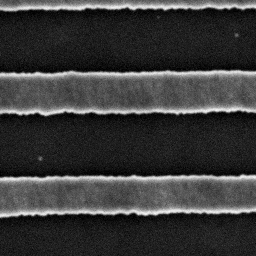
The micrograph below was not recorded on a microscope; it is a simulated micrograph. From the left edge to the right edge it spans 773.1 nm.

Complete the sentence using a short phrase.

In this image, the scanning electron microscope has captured lines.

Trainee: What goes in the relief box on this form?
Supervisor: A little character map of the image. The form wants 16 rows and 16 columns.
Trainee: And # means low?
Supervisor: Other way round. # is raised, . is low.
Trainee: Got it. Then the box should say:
##############.#
................
................
................
....#....#######
################
################
................
................
................
................
################
################
#...............
................
................